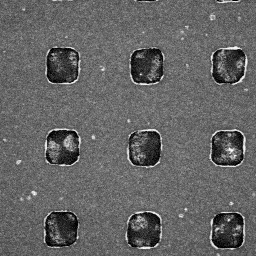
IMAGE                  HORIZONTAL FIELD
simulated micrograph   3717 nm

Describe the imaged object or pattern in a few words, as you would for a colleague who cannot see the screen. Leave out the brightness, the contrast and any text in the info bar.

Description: a regular array of holes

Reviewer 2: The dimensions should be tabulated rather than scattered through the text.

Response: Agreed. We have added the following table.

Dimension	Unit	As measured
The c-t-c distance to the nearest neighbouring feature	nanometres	1190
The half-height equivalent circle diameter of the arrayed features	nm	537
